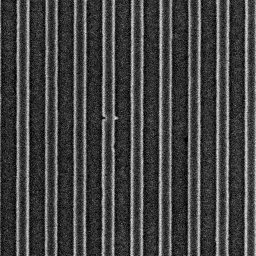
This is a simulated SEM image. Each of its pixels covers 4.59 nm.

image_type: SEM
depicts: parallel lines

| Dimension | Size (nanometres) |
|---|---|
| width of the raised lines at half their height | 49.3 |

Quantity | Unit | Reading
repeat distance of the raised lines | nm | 131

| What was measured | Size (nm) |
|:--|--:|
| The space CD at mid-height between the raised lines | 80.3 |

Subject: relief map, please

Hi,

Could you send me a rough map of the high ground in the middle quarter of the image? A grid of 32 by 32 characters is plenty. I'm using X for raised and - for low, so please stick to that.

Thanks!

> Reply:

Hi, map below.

---XX-----XX-----XX-----XXX----X
---XX-----XX-----XX-----XXX----X
---XX-----XX-----XX-----XXX----X
---XX-----XX-----XX-----XXX----X
---XX-----XX-----XX-----XXX----X
---XX-----XX-----XX-----XXX----X
---XX-----XX-----XX-----XXX----X
---XX-----XX-----XX-----XXX----X
---XX-----XX-----XX-----XXX----X
---XX-----XX-----XX-----XXX----X
---XX-----XX-----XX-----XXX----X
---XX-----XX-----XX-----XXX----X
---XX-----XXX----XX-----XXX----X
---XX-----XXX----XX-----XXX----X
---XX-----XX-----XX-----XXX----X
---XX-----XX-----XX-----XXX----X
---XX-----XX-----XX-----XXX----X
---XX-----XX-----XX-----XXX----X
---XX-----XX-----XX-----XXX----X
---XX-----XX-----XX-----XXX----X
---XX-----XX-----XX-----XXX----X
---XX-----XX-----XX-----XXX----X
---XX-----XX-----XX-----XXX----X
---XX-----XX-----XX-----XXX----X
---XX-----XX-----XX-----XXX----X
---XX-----XX-----XX-----XXX----X
---XX-----XX-----XX-----XXX----X
---XX-----XX-----XX-----XXX----X
---XX-----XX-----XX-----XXX----X
---XX-----XX-----XX-----XXX----X
---XX-----XX-----XXX----XXX----X
---XX-----XX-----XX-----XXX----X